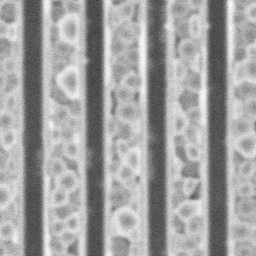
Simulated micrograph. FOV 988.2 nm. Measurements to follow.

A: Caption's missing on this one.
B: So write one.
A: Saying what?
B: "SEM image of one or a few lines or trenches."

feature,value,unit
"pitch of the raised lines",236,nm